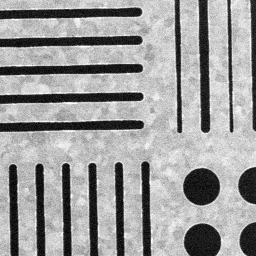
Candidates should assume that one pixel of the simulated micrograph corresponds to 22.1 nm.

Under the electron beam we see groups of lines, slits or small figures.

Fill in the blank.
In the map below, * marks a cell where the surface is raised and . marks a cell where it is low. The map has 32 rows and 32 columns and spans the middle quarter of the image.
....................********..**
....................********.***
..................**********.***
****************************.***
****************************.***
****************************.***
****************************..**
....................********..**
....................********..**
...................*********..**
****************************..**
****************************..**
****************************..**
****************************..**
....................********..**
....................********..**
...................*********..**
********************************
********************************
********************************
********************************
********************************
********************************
********************************
*************.******.***********
..****..****...****...**********
..****..****...****...**********
..****..****...****...*********.
..****..****...****...********..
..****..****...****...********..
..****..*****..****...********..
..****..*****..****...********..